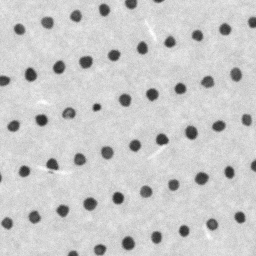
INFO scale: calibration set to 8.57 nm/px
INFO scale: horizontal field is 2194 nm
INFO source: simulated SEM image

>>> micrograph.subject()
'a regular array of holes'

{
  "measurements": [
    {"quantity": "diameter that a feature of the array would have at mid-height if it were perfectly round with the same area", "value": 0.115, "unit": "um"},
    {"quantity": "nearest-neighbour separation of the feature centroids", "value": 243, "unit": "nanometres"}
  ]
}